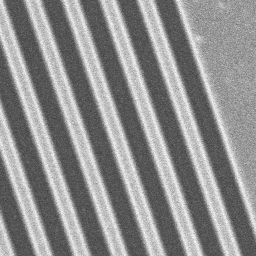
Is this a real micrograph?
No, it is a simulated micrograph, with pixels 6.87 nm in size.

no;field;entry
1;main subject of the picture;parallel lines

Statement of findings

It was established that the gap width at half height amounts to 142 nanometres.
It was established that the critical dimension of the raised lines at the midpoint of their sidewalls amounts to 0.101 um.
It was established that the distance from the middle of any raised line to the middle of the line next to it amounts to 0.245 um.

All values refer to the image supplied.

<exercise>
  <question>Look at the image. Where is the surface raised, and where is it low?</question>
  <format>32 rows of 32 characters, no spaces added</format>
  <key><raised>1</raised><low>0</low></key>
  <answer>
10011000110001100110001111111111
10001100110001100011001111111111
10001100011001100011000111111111
11001100011000110011000111111111
11000110011000110001100111111111
11000110001100110001100011111111
01100110001100011001100011111111
01100011001100011000110011111111
01100011000110011000110001111111
00110011000110001100110001111111
00110001100110001100011001111111
00110001100011001100011000111111
00011001100011000110011000111111
00011000110011000110001100011111
10011000110001100110001100011111
10001100110001100011000100011111
10001100011001100011000110001111
11001100011000110011000110001111
11000110011000110001100010001111
11000110001100110001100011000111
01100110001100011001100011000111
01100011001100011000110001000111
01100011000110011000110001100011
00110011000110001100111001100011
00110001100110001100011000110011
00110001100011001100011000110001
00011001100011000110011100110001
00011000110011000110001100011001
10011000110001100010001100011000
10001100110001100011000110011000
10001100011000100011000110001100
11001100011000110001000110001100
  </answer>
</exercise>